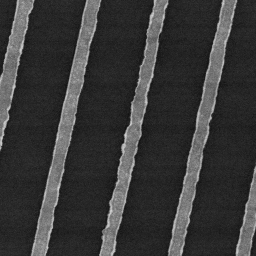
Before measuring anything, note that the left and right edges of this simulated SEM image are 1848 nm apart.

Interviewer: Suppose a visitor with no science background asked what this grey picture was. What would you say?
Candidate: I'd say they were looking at one or a few lines or trenches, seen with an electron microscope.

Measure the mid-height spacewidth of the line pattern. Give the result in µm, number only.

0.389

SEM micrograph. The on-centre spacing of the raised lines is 0.481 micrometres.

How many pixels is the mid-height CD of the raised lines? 12.3